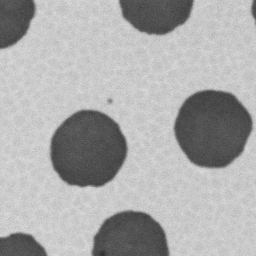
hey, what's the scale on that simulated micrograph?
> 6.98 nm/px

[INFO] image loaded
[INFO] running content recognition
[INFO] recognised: holes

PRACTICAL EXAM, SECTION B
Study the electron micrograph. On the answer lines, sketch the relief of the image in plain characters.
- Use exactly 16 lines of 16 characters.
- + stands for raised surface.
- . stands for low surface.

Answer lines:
..++++++....++++
..++++++...+++++
.+++++++++++++++
++++++++++++++++
++++++++++++++++
++++++++++++++++
+++++++++++....+
++++...++++.....
+++.....+++.....
+++.....+++....+
+++.....+++++.++
++++...+++++++++
++++++++++++++++
+++++++..+++++++
++++++....++++++
...+++.....+++++